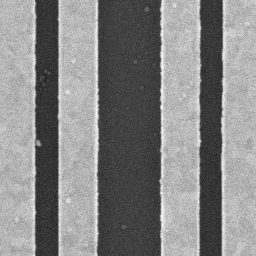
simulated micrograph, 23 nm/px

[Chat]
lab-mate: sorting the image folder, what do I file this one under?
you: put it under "lines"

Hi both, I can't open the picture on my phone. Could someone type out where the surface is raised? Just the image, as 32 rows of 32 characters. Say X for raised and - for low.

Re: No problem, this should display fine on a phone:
XXXX---XXXXX--------XXXXX---XXXX
XXXX---XXXXX--------XXXXX---XXXX
XXXX---XXXXX--------XXXXX---XXXX
XXXX---XXXXX--------XXXXX---XXXX
XXXX---XXXXX--------XXXXX---XXXX
XXXX---XXXXX--------XXXXX---XXXX
XXXX---XXXXX--------XXXXX---XXXX
XXXX---XXXXX--------XXXXX---XXXX
XXXX---XXXXX--------XXXXX---XXXX
XXXX---XXXXX--------XXXXX---XXXX
XXXX---XXXXX--------XXXXX---XXXX
XXXX---XXXXX--------XXXXX---XXXX
XXXX---XXXXX--------XXXXX---XXXX
XXXX---XXXXX--------XXXXX---XXXX
XXXX---XXXXX--------XXXXX---XXXX
XXXX---XXXXX--------XXXXX---XXXX
XXXX---XXXXX--------XXXXX---XXXX
XXXX---XXXXX--------XXXXX---XXXX
XXXX---XXXXX--------XXXXX---XXXX
XXXX---XXXXX--------XXXXX---XXXX
XXXX---XXXXX--------XXXXX---XXXX
XXXX---XXXXX--------XXXXX---XXXX
XXXX---XXXXX--------XXXXX---XXXX
XXXX---XXXXX--------XXXXX---XXXX
XXXX---XXXXX--------XXXXX---XXXX
XXXX---XXXXX--------XXXXX---XXXX
XXXX---XXXXX--------XXXXX---XXXX
XXXX---XXXXX--------XXXXX---XXXX
XXXX---XXXXX--------XXXXX---XXXX
XXXX---XXXXX--------XXXXX---XXXX
XXXX---XXXXX--------XXXXX---XXXX
XXXX---XXXXX--------XXXXX---XXXX